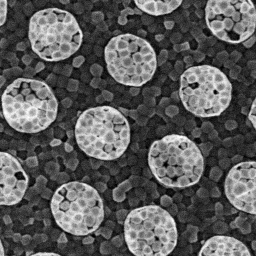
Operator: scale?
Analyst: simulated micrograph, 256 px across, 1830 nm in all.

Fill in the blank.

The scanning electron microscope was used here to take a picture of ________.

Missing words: raised bodies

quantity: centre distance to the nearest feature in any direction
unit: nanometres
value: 547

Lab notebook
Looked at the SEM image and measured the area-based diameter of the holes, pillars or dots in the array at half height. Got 329 nanometres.